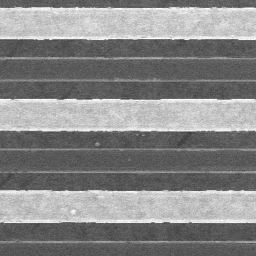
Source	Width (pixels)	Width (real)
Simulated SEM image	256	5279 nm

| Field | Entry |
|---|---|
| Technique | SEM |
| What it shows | lines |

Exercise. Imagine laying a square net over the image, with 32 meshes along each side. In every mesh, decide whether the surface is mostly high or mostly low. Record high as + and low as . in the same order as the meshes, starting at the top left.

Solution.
................................
++++++++++++++++++++++++++++++++
++++++++++++++++++++++++++++++++
++++++++++++++++++++++++++++++++
++++++++++++++++++++++++++++++++
................................
................................
++++++++++++++++++++++++++++++++
++++++++++++++++++++++++++++++++
++++++++++++++++++++++++++++++++
................................
................................
................................
++++++++++++++++++++++++++++++++
++++++++++++++++++++++++++++++++
++++++++++++++++++++++++++++++++
................................
................................
................................
++++++++++++++++++++++++++++++++
++++++++++++++++++++++++++++++++
................................
................................
................................
++++++++++++++++++++++++++++++++
++++++++++++++++++++++++++++++++
++++++++++++++++++++++++++++++++
++++++++++++++++++++++++++++++++
................................
................................
++++++++++++++++++++++++++++++++
++++++++++++++++++++++++++++++++